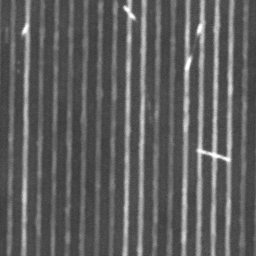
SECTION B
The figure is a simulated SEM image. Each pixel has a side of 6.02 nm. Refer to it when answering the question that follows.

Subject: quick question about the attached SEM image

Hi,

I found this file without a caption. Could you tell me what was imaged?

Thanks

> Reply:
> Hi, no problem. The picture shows parallel lines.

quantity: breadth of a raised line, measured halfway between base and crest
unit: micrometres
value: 0.0211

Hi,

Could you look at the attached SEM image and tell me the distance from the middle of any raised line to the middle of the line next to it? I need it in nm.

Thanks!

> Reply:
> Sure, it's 87.7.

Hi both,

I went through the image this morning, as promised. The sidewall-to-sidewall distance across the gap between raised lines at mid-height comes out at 67.8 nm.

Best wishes